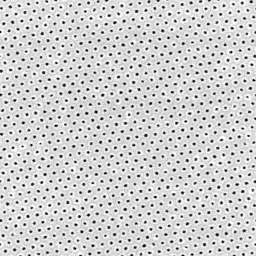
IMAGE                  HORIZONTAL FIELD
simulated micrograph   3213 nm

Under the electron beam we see a regular array of holes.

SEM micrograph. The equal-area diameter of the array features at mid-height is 0.0425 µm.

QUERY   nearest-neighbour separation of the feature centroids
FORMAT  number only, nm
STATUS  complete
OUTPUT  109